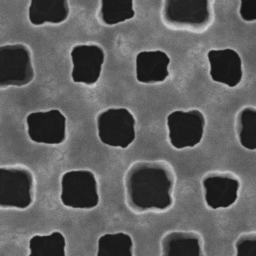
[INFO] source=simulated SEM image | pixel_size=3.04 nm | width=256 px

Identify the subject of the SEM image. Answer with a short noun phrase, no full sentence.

a regular array of holes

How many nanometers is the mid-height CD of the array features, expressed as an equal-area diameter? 113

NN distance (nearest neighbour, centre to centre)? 209 nanometers